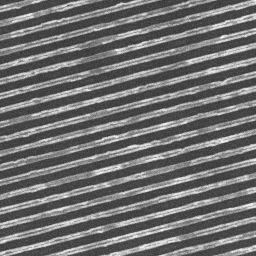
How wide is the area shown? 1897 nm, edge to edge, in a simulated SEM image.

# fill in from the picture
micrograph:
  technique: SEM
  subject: parallel lines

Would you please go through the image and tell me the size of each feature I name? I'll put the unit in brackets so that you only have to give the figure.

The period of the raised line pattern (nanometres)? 104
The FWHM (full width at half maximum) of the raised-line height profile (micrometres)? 0.0422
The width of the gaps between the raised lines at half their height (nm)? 63.7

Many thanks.